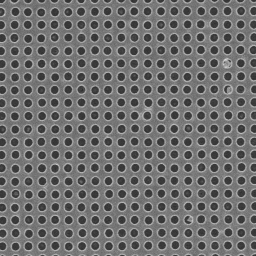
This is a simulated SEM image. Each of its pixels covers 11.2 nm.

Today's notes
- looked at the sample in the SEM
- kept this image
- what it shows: a regular array of holes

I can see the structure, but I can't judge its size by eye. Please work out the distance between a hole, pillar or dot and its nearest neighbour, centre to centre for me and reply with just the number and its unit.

142 nm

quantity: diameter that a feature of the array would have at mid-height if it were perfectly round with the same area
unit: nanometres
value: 91.9